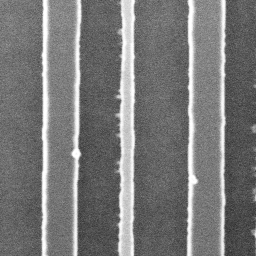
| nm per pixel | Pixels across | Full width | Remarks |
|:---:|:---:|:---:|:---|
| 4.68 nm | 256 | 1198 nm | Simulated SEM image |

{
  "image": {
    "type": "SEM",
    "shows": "lines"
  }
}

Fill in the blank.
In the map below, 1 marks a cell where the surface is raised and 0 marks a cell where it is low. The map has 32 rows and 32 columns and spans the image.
00000111110000011000000011110000
00000111110000011000000011110000
00000111110000011000000011110000
00000111110000011000000011110000
00000111110000011000000011110000
00000111110000011000000011110000
00000111110000011000000011110000
00000111110000011000000011110000
00000111110000011000000011110000
00000111110000011000000011110000
00000111110000011000000011110000
00000111110000011000000011110000
00000111110000011000000011110000
00000111110000011000000011110000
00000111110000011000000011110000
00000111110000011000000011110000
00000111110000011000000011110000
00000111110000011000000011110000
00000111110000011000000011110000
00000111110000011000000011110000
00000111110000011000000011110000
00000111110000011000000011110000
00000111110000011000000011110000
00000111110000011000000011110000
00000111110000011000000011110000
00000111110000011000000011110000
00000111110000010000000011110000
00000111110000011000000011110000
00000111110000010000000011110000
00000111110000011000000011110000
00000111110000011000000011110000
00000111110000011000000011110000